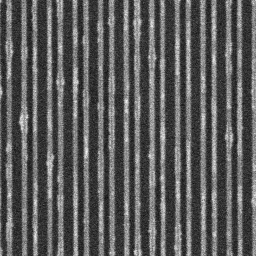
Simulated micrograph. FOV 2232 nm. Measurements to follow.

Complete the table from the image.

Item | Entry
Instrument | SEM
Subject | parallel lines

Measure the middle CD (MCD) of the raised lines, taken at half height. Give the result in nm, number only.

32.7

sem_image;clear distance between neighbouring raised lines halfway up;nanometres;68.1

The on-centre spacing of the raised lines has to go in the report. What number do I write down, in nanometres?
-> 112